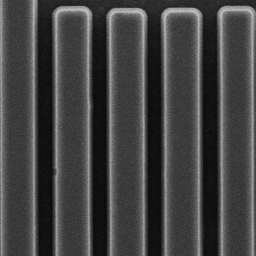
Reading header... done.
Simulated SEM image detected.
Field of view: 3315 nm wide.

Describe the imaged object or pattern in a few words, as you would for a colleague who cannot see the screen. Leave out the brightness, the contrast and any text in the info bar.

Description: parallel lines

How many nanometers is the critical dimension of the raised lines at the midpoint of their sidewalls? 481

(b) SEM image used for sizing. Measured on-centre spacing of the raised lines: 710 nm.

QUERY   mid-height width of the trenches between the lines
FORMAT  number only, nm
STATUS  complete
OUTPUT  235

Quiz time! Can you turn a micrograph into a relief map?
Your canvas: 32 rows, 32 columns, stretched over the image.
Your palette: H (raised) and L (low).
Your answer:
HHHHLLLLLLLLLLLLLLLLLLLLLLLLLLLL
HHHHLLLHHHHLLLHHHHLLLHHHHLLLHHHH
HHHHLLLHHHHLLLHHHHLLHHHHHLLHHHHH
HHHHLLLHHHHLLLHHHHLLHHHHHLLHHHHH
HHHHLLLHHHHLLLHHHHLLHHHHHLLHHHHH
HHHHLLLHHHHLLLHHHHLLHHHHHLLHHHHH
HHHHLLLHHHHLLLHHHHLLHHHHHLLHHHHH
HHHHLLLHHHHLLLHHHHLLHHHHHLLHHHHH
HHHHLLLHHHHLLLHHHHLLHHHHHLLHHHHH
HHHHLLLHHHHLLLHHHHLLHHHHHLLHHHHH
HHHHLLLHHHHLLLHHHHLLHHHHHLLHHHHH
HHHHLLLHHHHLLLHHHHLLHHHHHLLHHHHH
HHHHLLLHHHHLLLHHHHLLHHHHHLLHHHHH
HHHHLLLHHHHLLLHHHHLLHHHHHLLHHHHH
HHHHLLLHHHHLLLHHHHLLHHHHHLLHHHHH
HHHHLLLHHHHLLLHHHHLLHHHHHLLHHHHH
HHHHLLLHHHHLLLHHHHLLHHHHHLLHHHHH
HHHHLLLHHHHLLLHHHHLLHHHHHLLHHHHH
HHHHLLLHHHHLLLHHHHLLHHHHHLLHHHHH
HHHHLLLHHHHLLLHHHHLLHHHHHLLLHHHH
HHHHLLLHHHHLLLHHHHLLHHHHHLLLHHHH
HHHHLLLHHHHLLLHHHHLLHHHHHLLLHHHH
HHHHLLLHHHHLLLHHHHLLHHHHHLLLHHHH
HHHHLLLHHHHLLLHHHHLLHHHHHLLLHHHH
HHHHLLLHHHHLLLHHHHLLHHHHHLLLHHHH
HHHHLLLHHHHLLLHHHHLLHHHHHLLLHHHH
HHHHLLLHHHHLLLHHHHLLLHHHHLLLHHHH
HHHHLLLHHHHLLLHHHHLLLHHHHLLLHHHH
HHHHLLLHHHHLLLHHHHLLLHHHHLLLHHHH
HHHHLLLHHHHLLLHHHHLLLHHHHLLLHHHH
HHHHLLLHHHHLLLHHHHLLLHHHHLLLHHHH
HHHHLLLHHHHLLLHHHHLLLHHHHLLLHHHH